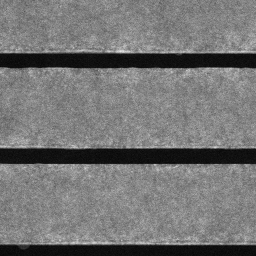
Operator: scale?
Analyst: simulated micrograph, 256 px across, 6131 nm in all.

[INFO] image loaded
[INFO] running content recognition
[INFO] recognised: lines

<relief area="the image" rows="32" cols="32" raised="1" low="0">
11111111111111111111111111111111
11111111111111111111111111111111
11111111111111111111111111111111
11111111111111111111111111111111
11111111111111111111111111111111
11111111111111111111111111111111
11111111111111111111111111111111
00000000000000000000000000000000
00000000000000000000000000000000
11111111111111111111111111111111
11111111111111111111111111111111
11111111111111111111111111111111
11111111111111111111111111111111
11111111111111111111111111111111
11111111111111111111111111111111
11111111111111111111111111111111
11111111111111111111111111111111
11111111111111111111111111111111
11111111111111111111111111111111
00000000000000000000000000000000
10001100000000000000000000000000
11111111111111111111111111111111
11111111111111111111111111111111
11111111111111111111111111111111
11111111111111111111111111111111
11111111111111111111111111111111
11111111111111111111111111111111
11111111111111111111111111111111
11111111111111111111111111111111
11111111111111111111111111111111
11111100111111111111111111111111
00000000000000000000000000000000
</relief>